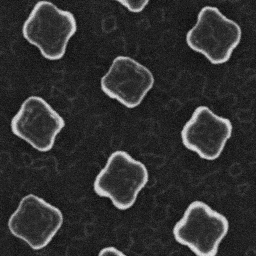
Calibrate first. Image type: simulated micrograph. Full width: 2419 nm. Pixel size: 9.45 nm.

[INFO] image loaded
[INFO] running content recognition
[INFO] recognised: raised bodies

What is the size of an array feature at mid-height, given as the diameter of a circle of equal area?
0.451 µm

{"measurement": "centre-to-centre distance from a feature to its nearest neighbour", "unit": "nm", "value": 894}